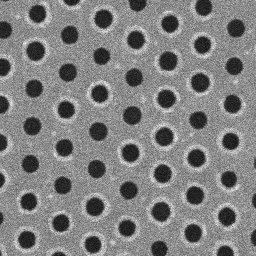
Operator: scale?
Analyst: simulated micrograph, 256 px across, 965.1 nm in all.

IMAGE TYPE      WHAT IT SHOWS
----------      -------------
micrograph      a regular array of holes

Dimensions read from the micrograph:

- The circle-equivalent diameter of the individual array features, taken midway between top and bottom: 68.9 nm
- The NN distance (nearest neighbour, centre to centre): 0.141 um